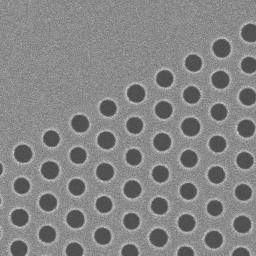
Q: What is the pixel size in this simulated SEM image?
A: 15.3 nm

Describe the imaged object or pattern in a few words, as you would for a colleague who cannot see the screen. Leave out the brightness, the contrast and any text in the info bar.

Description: a regular array of holes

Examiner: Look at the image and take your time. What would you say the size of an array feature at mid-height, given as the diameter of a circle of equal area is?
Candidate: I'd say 276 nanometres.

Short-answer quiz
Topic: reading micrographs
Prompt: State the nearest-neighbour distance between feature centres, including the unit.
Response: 485 nanometres